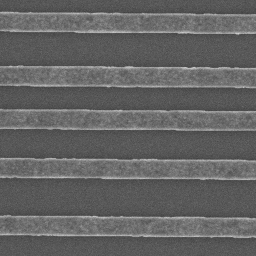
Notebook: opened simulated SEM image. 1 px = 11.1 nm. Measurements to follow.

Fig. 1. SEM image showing lines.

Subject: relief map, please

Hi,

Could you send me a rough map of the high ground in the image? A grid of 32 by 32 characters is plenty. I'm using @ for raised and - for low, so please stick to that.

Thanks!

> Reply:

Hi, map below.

--------------------------------
--------------------------------
@@@@@@@@@@@@@@@@@@@@@@@@@@@@@@@@
@@@@@@@@@@@@@@@@@@@@@@@@@@@@@@@@
--------------------------------
--------------------------------
--------------------------------
--------------------------------
@@@@@@@@@@@@@@@@@@@@@@@@@@@@@---
@@@@@@@@@@@@@@@@@@@@@@@@@@@@@@@@
@@@@@@@@@@@@@@@@@@@@@@@@@@@@@@@@
--------------------------------
--------------------------------
--------------------------------
@@@@@@@@@@@@@@@@@@@@@@@@@@@@@@@@
@@@@@@@@@@@@@@@@@@@@@@@@@@@@@@@@
--------------------------------
--------------------------------
--------------------------------
--------------------------------
@@@@@@@@@@@@@@@@@@@@@@@@@@@@@@@@
@@@@@@@@@@@@@@@@@@@@@@@@@@@@@@@@
--------------------------------
--------------------------------
--------------------------------
--------------------------------
--------------------------------
@@@@@@@@@@@@@@@@@@@@@@@@@@@@@@@@
@@@@@@@@@@@@@@@@@@@@@@@@@@@@@@@@
-----------------@@@@@@@@@@@@@@@
--------------------------------
--------------------------------